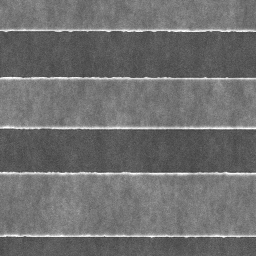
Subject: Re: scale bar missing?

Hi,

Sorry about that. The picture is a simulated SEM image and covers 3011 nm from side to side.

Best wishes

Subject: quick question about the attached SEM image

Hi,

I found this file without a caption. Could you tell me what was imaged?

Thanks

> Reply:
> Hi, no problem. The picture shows lines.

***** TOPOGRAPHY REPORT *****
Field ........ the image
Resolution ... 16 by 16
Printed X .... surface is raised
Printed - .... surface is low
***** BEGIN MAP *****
XXXXXXXXXXXXXXXX
XXXXXXXXXXXXXXXX
----------------
----------------
----------------
XXXXXXXXXXXXXXXX
XXXXXXXXXXXXXXXX
XXXXXXXXXXXXXXXX
----------------
----------------
----------------
XXXXXXXXXXXXXXXX
XXXXXXXXXXXXXXXX
XXXXXXXXXXXXXXXX
XXXXXXXXXXXXXXXX
----------------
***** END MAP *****